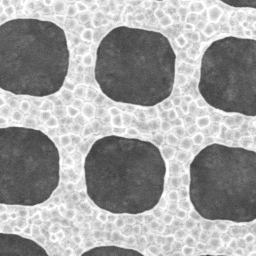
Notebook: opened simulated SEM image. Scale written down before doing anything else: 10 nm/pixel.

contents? holes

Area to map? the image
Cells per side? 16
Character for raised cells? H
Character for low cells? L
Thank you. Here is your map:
HHHHHHHHHHHHHHHH
LLLHHHHHHHHHHHHH
LLLLHHLLLLHHHHLL
LLLLHHLLLLLHHLLL
LLLLHHLLLLLHHLLL
LLLLHHLLLLLHLLLL
HHHHHHHHLLHHHLLL
HHHHHHHHHHHHHHHH
LLLHHHHHHHHHHHHH
LLLLHHLLLLHHLLLL
LLLLHLLLLLHHLLLL
LLLLHLLLLLHHLLLL
LLLHHHLLLLHHLLLL
HHHHHHHHHHHHHLLL
HHHHHHHHHHHHHHHH
LLLHHHLLHHHHHHHH